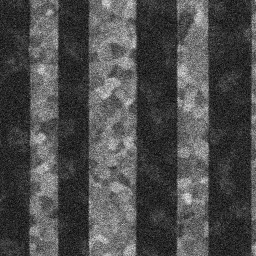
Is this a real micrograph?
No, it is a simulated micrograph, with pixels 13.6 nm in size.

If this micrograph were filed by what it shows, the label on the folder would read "one or a few lines or trenches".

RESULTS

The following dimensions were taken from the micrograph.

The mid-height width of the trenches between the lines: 577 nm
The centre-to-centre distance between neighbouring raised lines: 1010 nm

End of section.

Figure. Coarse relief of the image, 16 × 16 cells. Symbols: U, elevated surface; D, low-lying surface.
DDUUDDUUDDDUUDDD
DDUUDDUUDDDUUDDD
DDUUDDUUDDDUUDDD
DDUUDDUUDDDUUDDD
DDUUDDUUDDDUUDDD
DDUUDDUUUDDUUDDD
DDUUDDUUUDDUUDDD
DDUUDDUUUDDUUDDD
DDUUDDUUDDDUUDDD
DDUUDDUUUDDUUDDD
DDUUDDUUUDDUUDDD
DDUUDDUUDDDUUDDD
DDUUDDUUDDDUUDDD
DDUUDDUUDDDUUDDD
DDUUDDUUDDDUUDDD
DDUUDDUUDDDUUDDD